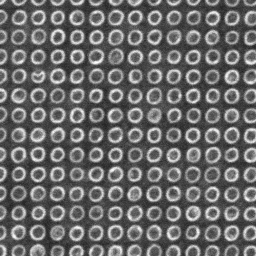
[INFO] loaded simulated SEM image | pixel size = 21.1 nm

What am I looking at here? a regular array of raised bodies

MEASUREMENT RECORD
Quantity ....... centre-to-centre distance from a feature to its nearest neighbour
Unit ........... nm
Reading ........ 404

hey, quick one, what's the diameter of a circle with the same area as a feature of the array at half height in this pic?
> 281 nm